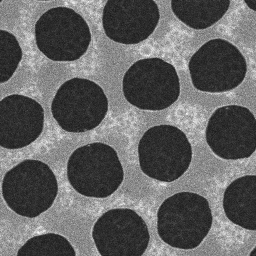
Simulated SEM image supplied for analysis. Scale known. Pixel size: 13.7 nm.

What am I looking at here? a regular array of holes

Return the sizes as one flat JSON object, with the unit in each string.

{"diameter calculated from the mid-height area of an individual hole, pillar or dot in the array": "766 nanometers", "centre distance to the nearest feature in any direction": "933 nm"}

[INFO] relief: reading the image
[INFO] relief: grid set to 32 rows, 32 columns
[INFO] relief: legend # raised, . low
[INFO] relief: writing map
#############.......#........##.
######....###.......##......####
#####......##.......##.....#####
####.......##......#####..######
..##.......##......#############
..###......#####.########....###
...##......#############......##
...####...#######...####.......#
..##############......##.......#
..#############.......##.......#
########....###.......##......##
#######......##.......####..####
....###......###......##########
.....#.......####....######....#
......#......#############......
.....##.....##############......
.....####.########.....###......
....#############.......##......
...#######....###.......##......
#########......##.......###....#
##....##.......##.......########
#......#.......###.....#########
.......##......#####..#######...
.......##......#############....
.......####...#######....###....
#......#############......##....
##...########....###......##....
############......##.......##...
############......##......####..
####....####.......#......######
###......###.......##....#######
##.......###......#############.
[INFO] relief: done